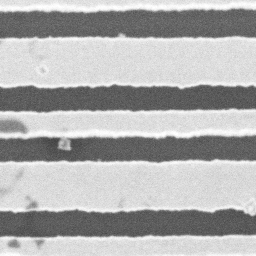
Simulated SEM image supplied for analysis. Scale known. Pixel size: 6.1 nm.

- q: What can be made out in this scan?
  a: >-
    lines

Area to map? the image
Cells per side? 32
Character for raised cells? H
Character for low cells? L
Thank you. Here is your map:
HHHHHHHHHHHHHHHHHHHHHHHHHHHHHHHH
LLLLLLLLLLLLLLLLLLLLLLLLLLLLLLLL
LLLLLLLLLLLLLLLLLLLLLLLLLLLLLLLL
LLLLLLLLLLLLLLLLLLLLLLLLLLLLLLLL
LLLLLLLLLLLLLLLLLLLLLLLLLLLLLLLL
HHHHHHHHHHHHHHHHHHHHHHHHHHHHHHHH
HHHHHHHHHHHHHHHHHHHHHHHHHHHHHHHH
HHHHHHHHHHHHHHHHHHHHHHHHHHHHHHHH
HHHHHHHHHHHHHHHHHHHHHHHHHHHHHHHH
HHHHHHHHHHHHHHHHHHHHHHHHHHHHHHHH
HHHHHHHHHHHHHHHHHHHHHHHHHLHHHHHH
LLLLLLLLLLLLLLLLLLLLLLLLLLLLLLLL
LLLLLLLLLLLLLLLLLLLLLLLLLLLLLLLL
LLLLLLLLLLLLLLLLLLLLLLLLLLLLLLLL
HHHHHHHHHHHHHHHHHHHHHHHHHHHHHHHH
HHHHHHHHHHHHHHHHHHHHHHHHHHHHHHHH
HHHHHHHHHHHHHHHHHHHHHHHHHHHHHHHH
LLLLLLLHHLLLLLLLLLLLLLLLLLLLLLLL
LLLLLLLLLLLLLLLLLLLLLLLLLLLLLLLL
LLLLLLLLLLLLLLLLLLLLLLLLLLLLLLLL
HHHHHHHHHHHHHHHHHHHHHHHHHHHHHHHH
HHHHHHHHHHHHHHHHHHHHHHHHHHHHHHHH
HHHHHHHHHHHHHHHHHHHHHHHHHHHHHHHH
HHHHHHHHHHHHHHHHHHHHHHHHHHHHHHHH
HHHHHHHHHHHHHHHHHHHHHHHHHHHHHHHH
HHHHHHHHHHHHHHHHHHHHHHHHHHHHHHHH
LLLLLLLLLLLLLLLLLLLLLLLLLLLLLLLH
LLLLLLLLLLLLLLLLLLLLLLLLLLLLLLLL
LLLLLLLLLLLLLLLLLLLLLLLLLLLLLLLL
LLLLLLLLLLLLLLLLLLHLLLLHLLLLHHHH
HHHHHHHHHHHHHHHHHHHHHHHHHHHHHHHH
HHHHHHHHHHHHHHHHHHHHHHHHHHHHHHHH